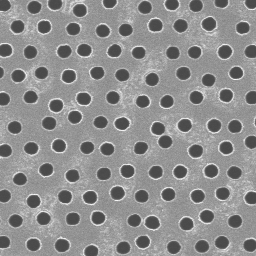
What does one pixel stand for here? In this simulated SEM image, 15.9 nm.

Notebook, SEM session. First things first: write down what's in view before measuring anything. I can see a regular array of holes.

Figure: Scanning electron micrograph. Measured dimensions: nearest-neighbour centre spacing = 368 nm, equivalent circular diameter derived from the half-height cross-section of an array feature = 198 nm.